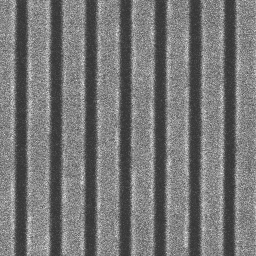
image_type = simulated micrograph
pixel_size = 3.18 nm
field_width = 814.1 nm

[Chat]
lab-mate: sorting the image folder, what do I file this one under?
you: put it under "parallel lines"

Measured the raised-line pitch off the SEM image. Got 111 nm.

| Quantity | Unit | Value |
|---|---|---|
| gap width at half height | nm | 36.6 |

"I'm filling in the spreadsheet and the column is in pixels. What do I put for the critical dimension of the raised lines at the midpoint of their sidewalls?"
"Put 23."